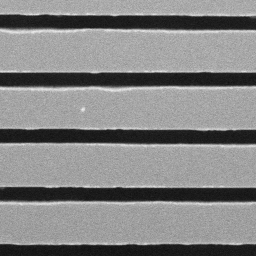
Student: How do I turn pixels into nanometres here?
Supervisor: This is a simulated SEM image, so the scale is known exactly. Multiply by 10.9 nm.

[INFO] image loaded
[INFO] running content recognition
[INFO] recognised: lines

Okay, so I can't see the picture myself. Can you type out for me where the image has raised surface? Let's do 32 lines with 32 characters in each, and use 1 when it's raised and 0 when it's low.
11111111111111111111111111111111
11111111111111111111111111111111
00000000000000000000000000000000
00000000000000000000000000000000
11111111111111111111111111111111
11111111111111111111111111111111
11111111111111111111111111111111
11111111111111111111111111111111
11111111111111111111111111111111
00000000000000000000000000000000
00000000000000000000000000000000
11111111111111111111111111111111
11111111111111111111111111111111
11111111111111111111111111111111
11111111111111111111111111111111
11111111111111111111111111111111
00000000000000000000000000000000
00000000000000000000000000000000
11111111111111111111111111111111
11111111111111111111111111111111
11111111111111111111111111111111
11111111111111111111111111111111
11111111111111111111111111111111
00000000000000000000000000000000
00000000000000000000000000000000
11111111111111111111111111111111
11111111111111111111111111111111
11111111111111111111111111111111
11111111111111111111111111111111
11111111111111111111111111111111
01111111111111110111001111111111
00000000000000000000000000000000